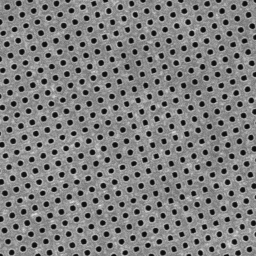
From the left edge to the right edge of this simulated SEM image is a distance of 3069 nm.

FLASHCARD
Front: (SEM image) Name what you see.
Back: a regular array of holes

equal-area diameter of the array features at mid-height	74.1	nm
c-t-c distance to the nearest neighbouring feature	0.139	microns